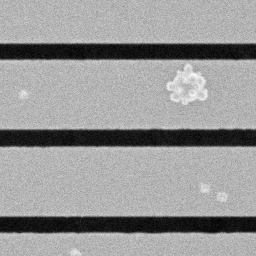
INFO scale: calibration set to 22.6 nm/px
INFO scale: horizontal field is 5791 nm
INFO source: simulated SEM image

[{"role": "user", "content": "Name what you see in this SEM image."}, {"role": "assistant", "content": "lines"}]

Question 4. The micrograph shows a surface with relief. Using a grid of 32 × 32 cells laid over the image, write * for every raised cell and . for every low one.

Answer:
********************************
********************************
********************************
********************************
********************************
................................
................................
................................
********************************
********************************
********************************
********************************
********************************
********************************
********************************
********************************
................................
................................
********************************
********************************
********************************
********************************
********************************
********************************
********************************
********************************
********************************
................................
................................
********************************
********************************
********************************